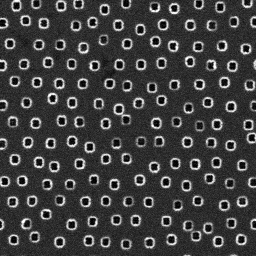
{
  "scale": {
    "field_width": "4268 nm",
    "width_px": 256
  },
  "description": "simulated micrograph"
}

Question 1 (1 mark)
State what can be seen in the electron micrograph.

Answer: a regular array of holes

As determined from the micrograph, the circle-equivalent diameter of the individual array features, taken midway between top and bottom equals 0.136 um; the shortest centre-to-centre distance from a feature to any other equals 322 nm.